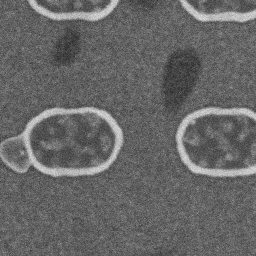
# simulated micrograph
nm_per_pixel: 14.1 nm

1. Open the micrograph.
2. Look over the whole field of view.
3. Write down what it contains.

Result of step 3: raised bodies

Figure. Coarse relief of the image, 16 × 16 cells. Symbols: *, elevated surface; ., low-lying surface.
..*****.....****
................
................
................
................
................
................
..*****.....****
..*****....*****
..*****....*****
...***......****
................
................
................
................
................